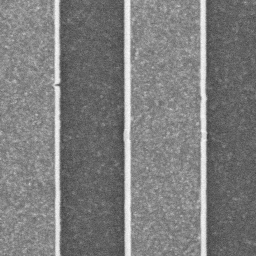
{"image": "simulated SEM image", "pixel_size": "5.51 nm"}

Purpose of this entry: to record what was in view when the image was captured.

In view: one or a few lines or trenches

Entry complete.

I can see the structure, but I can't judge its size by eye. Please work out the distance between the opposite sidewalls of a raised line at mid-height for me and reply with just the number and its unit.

0.426 microns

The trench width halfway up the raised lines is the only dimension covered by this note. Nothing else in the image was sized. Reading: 382 nm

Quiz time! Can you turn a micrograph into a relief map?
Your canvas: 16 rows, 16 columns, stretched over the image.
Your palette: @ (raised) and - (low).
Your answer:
@@@@----@@@@@---
@@@@----@@@@@---
@@@@----@@@@@---
@@@@----@@@@@---
@@@@----@@@@@---
@@@@----@@@@@---
@@@@----@@@@@---
@@@@----@@@@@---
@@@@----@@@@@---
@@@@----@@@@@---
@@@@----@@@@@---
@@@@----@@@@@---
@@@@----@@@@@---
@@@@----@@@@@---
@@@@----@@@@@---
@@@@----@@@@@---